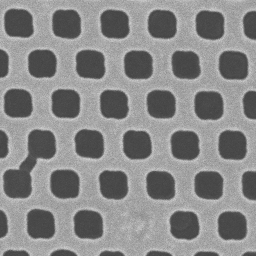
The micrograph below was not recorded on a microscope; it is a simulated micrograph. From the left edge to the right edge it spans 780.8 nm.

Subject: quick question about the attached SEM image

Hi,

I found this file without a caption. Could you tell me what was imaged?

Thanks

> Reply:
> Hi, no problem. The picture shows a regular array of holes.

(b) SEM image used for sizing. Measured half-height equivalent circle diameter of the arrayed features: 93.3 nm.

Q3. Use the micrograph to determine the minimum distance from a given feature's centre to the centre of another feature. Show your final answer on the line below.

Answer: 0.141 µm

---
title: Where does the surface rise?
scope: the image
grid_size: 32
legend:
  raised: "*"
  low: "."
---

********************************
*...***...***..****..****..****.
*...***...***...***...**....**..
*...***...***...***...***...**..
*...***...***...***...***...***.
********************************
.***...***..****..****..****..**
.**....**....***...**....**....*
.***...***...***...***...**....*
.***...***...***...***...***...*
********************************
*..****...***..****..****..****.
....**....**....**....**....**..
....**....***...**....**....**..
*...***...***...***...***...***.
********************************
.***..****..****..****..****..**
.**....**....**....**....**....*
.**....**....**....**....**....*
.**....***...***...***...***...*
***.****************************
*...***..****..****.*****..****.
....**....**....**....**....**..
....**....**....**....**....**..
*...***...***...***...***...***.
********************************
****..****..**********..****..**
.**....**....********....**....*
.**....**....********....**....*
.***...***...*********...***...*
********************************
*..****..****..****..****.*****.